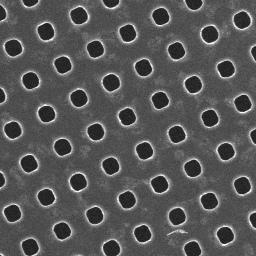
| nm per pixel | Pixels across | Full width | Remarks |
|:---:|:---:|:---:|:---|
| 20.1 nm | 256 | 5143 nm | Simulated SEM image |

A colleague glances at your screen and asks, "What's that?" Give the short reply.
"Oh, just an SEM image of a regular array of holes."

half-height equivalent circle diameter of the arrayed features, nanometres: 344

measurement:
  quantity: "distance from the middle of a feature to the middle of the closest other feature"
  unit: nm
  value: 727